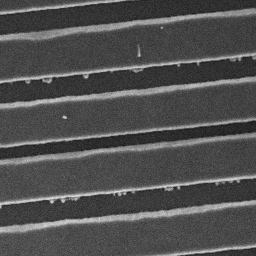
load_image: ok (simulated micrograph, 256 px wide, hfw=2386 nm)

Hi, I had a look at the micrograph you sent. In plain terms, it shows lines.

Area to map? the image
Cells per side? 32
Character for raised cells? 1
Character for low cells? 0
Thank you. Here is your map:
11111111111000000000000000000000
11100000000000000000000000000011
00000000000000000000111111111111
00000000000111111111111111111111
00111111111111111111111111111111
11111111111111111111111111111111
11111111111111111111111111111111
11111111111111111111111111000000
11111111111111111000000000000000
11111111000000000000000000000000
00000000000000000000000001111111
00000000000000001111111111111111
00000001111111111111111111111111
11111111111111111111111111111111
11111111111111111111111111111111
11111111111111111111111111100000
11111111111111111100000000000000
11111111100000000000000001111111
00000000000000011111111111111111
00000001111111111111111111111111
11111111111111111111111111111111
11111111111111111111111111111111
11111111111111111111111111111000
11111111111111111110000000000000
11111111110000000000000000000000
10000000000000000000000000000111
00000000000000000000011111111111
00000000000111111111111111111111
00011111111111111111111111111111
11111111111111111111111111111111
11111111111111111111111111111111
11111111111111111111111110000000